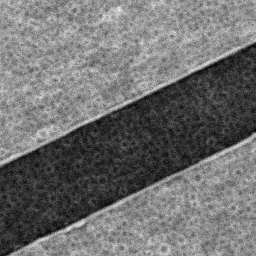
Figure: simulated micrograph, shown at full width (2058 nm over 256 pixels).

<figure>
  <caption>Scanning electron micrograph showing one or a few lines or trenches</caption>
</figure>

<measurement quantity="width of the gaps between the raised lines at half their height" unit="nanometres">683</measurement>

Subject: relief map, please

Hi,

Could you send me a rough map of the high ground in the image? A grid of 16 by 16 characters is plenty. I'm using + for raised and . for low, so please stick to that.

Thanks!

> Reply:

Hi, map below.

++++++++++++++++
++++++++++++++++
++++++++++++++++
++++++++++++++..
++++++++++++....
++++++++++......
++++++++........
++++++..........
++++............
++............++
............++++
..........++++++
........++++++++
......++++++++++
....++++++++++++
..++++++++++++++